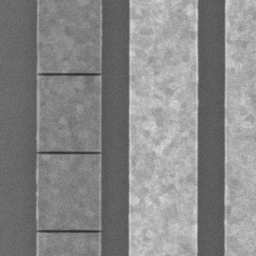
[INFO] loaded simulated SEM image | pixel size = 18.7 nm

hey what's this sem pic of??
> wiring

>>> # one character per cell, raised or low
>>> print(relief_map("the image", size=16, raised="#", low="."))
..####..####..##
..####..####..##
..####..####..##
..####..####..##
..####..####..##
..####..####..##
..####..####..##
..####..####..##
..####..####..##
..####..####..##
..####..####..##
..####..####..##
..####..####..##
..####..####..##
..####..####..##
..####..####..##